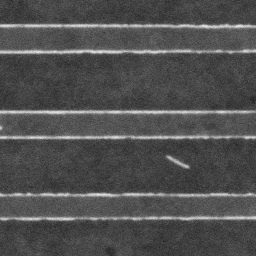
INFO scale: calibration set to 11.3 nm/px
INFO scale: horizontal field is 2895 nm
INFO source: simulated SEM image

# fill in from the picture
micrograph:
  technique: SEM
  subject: lines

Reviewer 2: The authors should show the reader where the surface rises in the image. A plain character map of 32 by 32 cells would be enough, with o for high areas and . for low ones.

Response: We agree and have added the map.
................................
................................
................................
oooooooooooooooooooooooooooooooo
oooooooooooooooooooooooooooooooo
oooooooooooooooooooooooooooooooo
ooooooooooooooooooooo...o...o...
................................
................................
................................
................................
................................
................................
................................
oooooooooooooooooooooooooooooooo
oooooooooooooooooooooooooooooooo
oooooooooooooooooooooooooooooooo
................................
................................
................................
................................
................................
................................
................................
oooooooooooooooooooooooooooooooo
oooooooooooooooooooooooooooooooo
oooooooooooooooooooooooooooooooo
................................
................................
................................
................................
................................